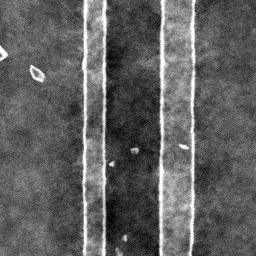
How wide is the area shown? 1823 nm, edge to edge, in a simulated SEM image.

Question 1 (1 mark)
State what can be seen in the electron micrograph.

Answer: lines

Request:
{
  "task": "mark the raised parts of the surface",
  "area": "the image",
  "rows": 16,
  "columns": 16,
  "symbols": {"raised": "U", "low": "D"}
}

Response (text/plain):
DDDDDUUDDDUUDDDD
DDDDDUUDDDUUDDDD
DDDDDUUDDDUUDDDD
DDDDDUUDDDUUDDDD
DDDDDUUDDDUUDDDD
DDDDDUUDDDUUDDDD
DDDDDUUDDDUUDDDD
DDDDDUUDDDUUDDDD
DDDDDUDDDDUUDDDD
DDDDDUDDDDUUDDDD
DDDDDUUDDDUUDDDD
DDDDDUUDDDUUDDDD
DDDDDUUDDDUUDDDD
DDDDDUUDDDUUDDDD
DDDDDUUDDDUUDDDD
DDDDDUUDDDUUDDDD